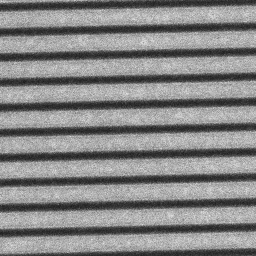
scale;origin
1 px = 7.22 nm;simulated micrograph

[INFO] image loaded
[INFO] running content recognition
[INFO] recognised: parallel lines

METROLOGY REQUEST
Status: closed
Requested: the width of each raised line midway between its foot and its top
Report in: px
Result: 10.6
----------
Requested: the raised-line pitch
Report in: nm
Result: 181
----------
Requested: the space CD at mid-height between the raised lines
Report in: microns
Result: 0.103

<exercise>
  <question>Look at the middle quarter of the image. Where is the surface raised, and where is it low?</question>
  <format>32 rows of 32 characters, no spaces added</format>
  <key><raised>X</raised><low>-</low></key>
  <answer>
--------------------------------
--------------------------------
--------------------XXXXXXXXXXXX
XXXXXXXXXXXXXXXXXXXXXXXXXXXXXXXX
XXXXXXXXXXXXXXXXXXXXXXXXXXXXXXXX
X-------------------------------
--------------------------------
--------------------------------
------------------------------XX
XXXXXXXXXXXXXXXXXXXXXXXXXXXXXXXX
XXXXXXXXXXXXXXXXXXXXXXXXXXXXXXXX
XXXXXXXXXXXXXXXX----------------
--------------------------------
--------------------------------
--------------------------------
--XXXXXXXXXXXXXXXXXXXXXXXXXXXXXX
XXXXXXXXXXXXXXXXXXXXXXXXXXXXXXXX
XXXXXXXXXXXXXXXXXXXXXXXXX-------
--------------------------------
--------------------------------
--------------------------------
-------------XXXXXXXXXXXXXXXXXXX
XXXXXXXXXXXXXXXXXXXXXXXXXXXXXXXX
XXXXXXXXXXXXXXXXXXXXXXXXXXXXXXXX
--------------------------------
--------------------------------
--------------------------------
--------------------------XXXXXX
XXXXXXXXXXXXXXXXXXXXXXXXXXXXXXXX
XXXXXXXXXXXXXXXXXXXXXXXXXXXXXXXX
XXXXXX--------------------------
--------------------------------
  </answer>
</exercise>